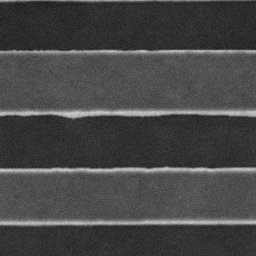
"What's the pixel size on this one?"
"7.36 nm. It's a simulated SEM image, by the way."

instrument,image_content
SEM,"lines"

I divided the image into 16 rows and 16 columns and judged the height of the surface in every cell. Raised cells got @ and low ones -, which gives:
----------------
----------------
----------------
@@@@@@@@@@@@@@@@
@@@@@@@@@@@@@@@@
@@@@@@@@@@@@@@@@
@@@@@@@@@@@@@@@@
----------------
----------------
----------------
----------------
@@@@@@@@@@@@@@@@
@@@@@@@@@@@@@@@@
@@@@@@@@@@@@@@@@
----------------
----------------